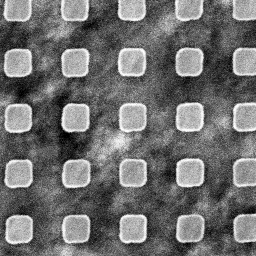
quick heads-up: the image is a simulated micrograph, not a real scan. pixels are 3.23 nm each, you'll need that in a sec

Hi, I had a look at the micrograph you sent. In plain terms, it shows a regular array of raised bodies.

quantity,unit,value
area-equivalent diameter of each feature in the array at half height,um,0.0942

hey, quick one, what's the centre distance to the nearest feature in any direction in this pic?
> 0.178 µm